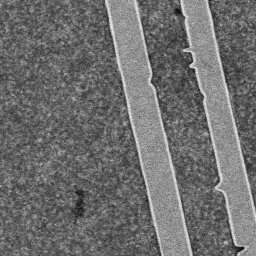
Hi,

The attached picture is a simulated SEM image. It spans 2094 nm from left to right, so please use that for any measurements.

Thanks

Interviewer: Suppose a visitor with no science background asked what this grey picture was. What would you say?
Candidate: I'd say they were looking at one or a few lines or trenches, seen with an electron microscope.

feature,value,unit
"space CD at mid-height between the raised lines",367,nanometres